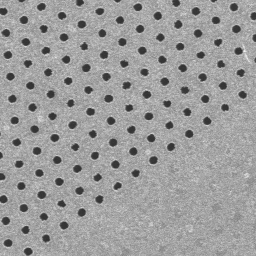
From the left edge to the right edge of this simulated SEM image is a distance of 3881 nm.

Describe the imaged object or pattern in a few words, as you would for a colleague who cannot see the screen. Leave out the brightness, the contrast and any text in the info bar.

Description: a regular array of holes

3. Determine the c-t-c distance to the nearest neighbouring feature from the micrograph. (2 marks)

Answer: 329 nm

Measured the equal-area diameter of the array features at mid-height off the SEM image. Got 0.127 micrometres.